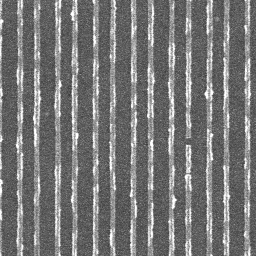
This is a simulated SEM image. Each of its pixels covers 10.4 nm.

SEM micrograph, parallel lines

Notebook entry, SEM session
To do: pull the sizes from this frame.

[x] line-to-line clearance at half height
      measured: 164 nm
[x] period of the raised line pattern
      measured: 0.197 microns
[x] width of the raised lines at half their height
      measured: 48.1 nm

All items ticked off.